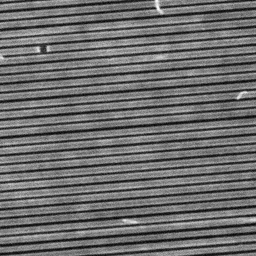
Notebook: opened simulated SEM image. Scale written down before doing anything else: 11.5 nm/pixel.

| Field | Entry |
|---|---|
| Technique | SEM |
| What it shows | parallel lines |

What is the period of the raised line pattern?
103 nanometres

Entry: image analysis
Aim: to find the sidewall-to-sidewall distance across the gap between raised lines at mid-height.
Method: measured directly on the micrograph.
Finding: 38.6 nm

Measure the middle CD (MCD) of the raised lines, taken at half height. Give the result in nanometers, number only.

58.6